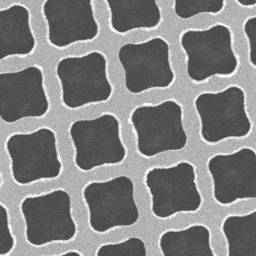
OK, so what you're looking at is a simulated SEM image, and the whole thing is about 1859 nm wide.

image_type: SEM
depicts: a regular array of holes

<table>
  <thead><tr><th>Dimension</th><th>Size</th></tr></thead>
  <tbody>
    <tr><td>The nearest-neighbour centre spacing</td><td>0.462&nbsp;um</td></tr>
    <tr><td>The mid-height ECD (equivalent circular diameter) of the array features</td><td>385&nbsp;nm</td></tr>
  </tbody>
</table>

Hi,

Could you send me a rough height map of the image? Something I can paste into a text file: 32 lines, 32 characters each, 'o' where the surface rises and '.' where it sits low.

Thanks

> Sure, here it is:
oooooo.....ooo......oo......oo..
...ooo......oo......oo.....ooooo
....oo......oo......ooooooooooo.
....oo......oo...ooooooooo..ooo.
....oo......ooooooooooo......oo.
....ooo..oooooooo....oo......oo.
....ooooooooooo......oo......oo.
oooooooo.....oo......oo.......o.
ooo..oo......oo......oo......ooo
.....oo......ooo......oo..oooooo
.....ooo......oo.....ooooooooooo
.....ooo......oooooooooooooo..oo
......oo.....oooooooooooo......o
......ooooooooooo......oo......o
.....oooooooo.oo.......oo......o
ooooooooo......oo......oo......o
oooo..ooo......oo......oo......o
o......oo......oo......ooo..oooo
o......oo......oo......ooooooooo
o......ooo.....oooooooooooo.....
o.......oo...ooooooooo..oo......
oo.....oooooooooooo.....oo......
oo..oooooooooo..oo......ooo.....
ooooooooooo......oo......oo.....
ooooo....oo......oo......oo.....
ooo......oo......oo......ooooooo
.oo......oo......oo...oooooooooo
.oo......oo......ooooooooooo....
.oo......ooo..oooooooooo..oo....
.oo......ooooooooooo......oo....
..oo.ooooooooo....oo......ooo...
.ooooooooooo......oo.......oo...